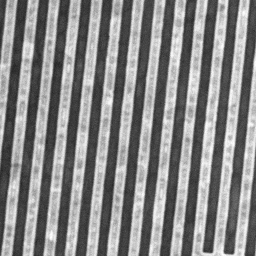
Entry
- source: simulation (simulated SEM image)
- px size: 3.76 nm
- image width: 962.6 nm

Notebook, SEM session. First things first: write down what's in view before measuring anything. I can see parallel lines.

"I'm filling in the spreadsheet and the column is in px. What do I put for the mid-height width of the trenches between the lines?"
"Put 13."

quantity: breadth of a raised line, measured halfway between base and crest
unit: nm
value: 29.9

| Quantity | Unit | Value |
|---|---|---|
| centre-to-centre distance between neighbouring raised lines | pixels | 21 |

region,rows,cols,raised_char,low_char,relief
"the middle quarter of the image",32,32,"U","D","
UUDDDDUUDDDUUDDDUUDDDUUDDDDUUDDD
UUDDDUUUDDDUUDDDUUDDDUUDDDUUDDDD
UUDDDUUDDDUUDDDDUUDDDUUDDDUUDDDD
UUDDDUUDDDUUDDDDUUDDDUUDDDUUDDDD
UUDDDUUDDDUUDDDDUUDDDUUDDDUUDDDU
UUDDDUUDDDUUDDDUUDDDDUUDDDUUDDDU
UUDDDUUDDDUUDDDUUDDDDUUDDDUUDDDU
UDDDDUUDDDUUDDDUUDDDDUUDDDUUDDDU
UDDDDUUDDDUUDDDUUDDDUUDDDDUUDDDU
UDDDUUDDDDUUDDDUUDDDUUDDDDUUDDDU
UDDDUUDDDDUUDDDUUDDDUUDDDDUUDDDU
UDDDUUDDDDUUDDDUUDDDUUDDDUUDDDDU
UDDDUUDDDDUDDDDUUDDDUUDDDUUDDDDU
UDDDUUDDDDUUDDDUUDDDUUDDDUUDDDUU
UDDDUUDDDUUDDDDUUDDDUUDDDUUDDDUU
UDDDUUDDDUUDDDUUDDDDUUDDDUUDDDUU
DDDDUUDDDUUDDDUUDDDDUUDDDUUDDDUU
DDDDUUDDDUUDDDUUDDDUUUDDDUUDDDUU
DDDDUUDDDUUDDDUUDDDUUDDDDUUDDDUU
DDDUUDDDDUUDDDUUDDDUUDDDDUUDDDUU
DDDUUDDDDUUDDDUUDDDUUDDDUUDDDDUU
DDDUUDDDUUUDDDUUDDDUUDDDUUDDDDUU
DDDUUDDDUUDDDDUUDDDUUDDDUUDDDDUU
DDDUUDDDUUDDDDUUDDDUUDDDUUDDDUUD
DDDUUDDDUUDDDUUDDDDUUDDDUUDDDUUD
DDDUUDDDUUDDDUUDDDDUUDDDUUDDDUUD
DDDUUDDDUUDDDUUDDDDUUDDDUUDDDUUD
DDDUUDDDUUDDDUUDDDUUDDDDUUDDDUUD
DDDUDDDDUUDDDUUDDDUUDDDDUUDDDUUD
DDDUDDDDUUDDDUUDDDUUDDDDUUDDDUUD
DDUUDDDDUUDDDUUDDDUUDDDUUDDDDUUD
DDUUDDDDUDDDDUUDDDUUDDDUUDDDDUUD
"